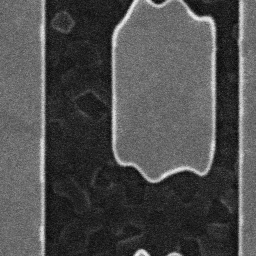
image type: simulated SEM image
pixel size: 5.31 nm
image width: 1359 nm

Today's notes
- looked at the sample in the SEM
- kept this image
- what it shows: one or a few lines or trenches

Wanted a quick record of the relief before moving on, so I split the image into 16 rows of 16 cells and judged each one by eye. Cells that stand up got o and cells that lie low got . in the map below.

ooo.....oooo...o
ooo.....ooooo..o
ooo....oooooo..o
ooo....oooooo..o
ooo....oooooo..o
ooo....oooooo..o
ooo....oooooo..o
ooo....oooooo..o
ooo....oooooo..o
ooo....oooooo..o
ooo......oooo..o
ooo............o
ooo............o
ooo............o
ooo............o
ooo............o